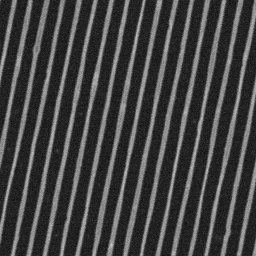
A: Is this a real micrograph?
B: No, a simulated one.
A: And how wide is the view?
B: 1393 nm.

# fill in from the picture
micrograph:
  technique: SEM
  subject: parallel lines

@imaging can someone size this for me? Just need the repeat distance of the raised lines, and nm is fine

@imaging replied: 86.3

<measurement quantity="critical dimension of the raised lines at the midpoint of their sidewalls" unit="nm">20.7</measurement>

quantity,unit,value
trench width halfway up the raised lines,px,12.1